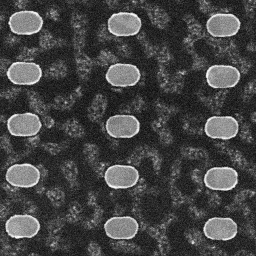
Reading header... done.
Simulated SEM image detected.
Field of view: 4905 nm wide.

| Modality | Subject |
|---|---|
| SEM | a regular array of raised bodies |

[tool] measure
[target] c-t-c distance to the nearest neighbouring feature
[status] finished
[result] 969 nm